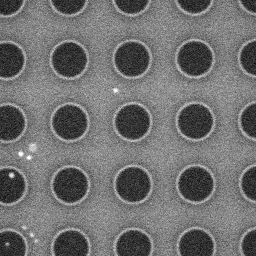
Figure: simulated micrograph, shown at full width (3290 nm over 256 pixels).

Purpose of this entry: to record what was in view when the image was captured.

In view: an array of small figures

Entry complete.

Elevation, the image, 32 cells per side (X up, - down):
XXX---XXXXX---XXXXX---XXXX----XX
XX-----XXX-----XXX-----XXX-----X
--------------------------------
--------------------------------
--------------------------------
XX-----XXX-----XXX-----XXX-----X
XXX----XXXX---XXXXX---XXXXX---XX
XXX---XXXXX---XXXXX---XXXXX---XX
XXX----XXXX---XXXXX---XXXX----XX
XX-----XXX-----XXX-----XX------X
--------------------------------
--------------------------------
--------------------------------
XX-----XXX-----XXX-----XXX-----X
XXX---XXXXX---XXXXX---XXXXX---XX
XXX---XXXXX---XXXXX---XXXXX---XX
XXX----XXXX----XXXX---XXXX----XX
XX------XX------X-------X-------
--------------------------------
--------------------------------
--------------------------------
XXX----XXXX----XXX-----XXX----XX
XXX----XXXX---XXXXX---XXXXX---XX
XXX---XXXXX---XXXXX---XXXXX---XX
XXX----XXXX----XXXX----XXX-----X
XX------------------------------
--------------------------------
--------------------------------
------------------------X-------
XXX----XXXX----XXXX----XXX----XX
XXX----XXXX---XXXXX---XXXXX---XX
XXX----XXXX---XXXXX---XXXXX---XX